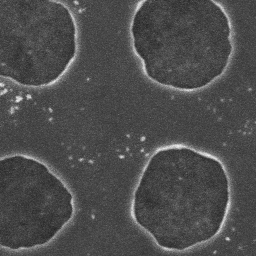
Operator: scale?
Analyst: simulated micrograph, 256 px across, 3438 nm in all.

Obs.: holes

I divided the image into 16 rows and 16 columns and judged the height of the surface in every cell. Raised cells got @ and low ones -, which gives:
----@@@@@-----@@
-----@@@------@@
-----@@@------@@
-----@@@@-----@@
----@@@@@-----@@
@@@@@@@@@@@-@@@@
@@@@@@@@@@@@@@@@
@@@@@@@@@@@@@@@@
@@@@@@@@@@@@@@@@
@@@@@@@@@@--@@@@
---@@@@@@-----@@
----@@@@@-----@@
----@@@@------@@
----@@@@------@@
----@@@@@-----@@
@@@@@@@@@@@-@@@@